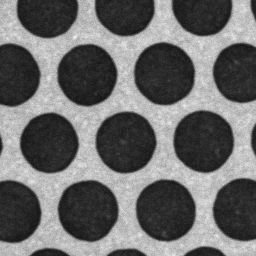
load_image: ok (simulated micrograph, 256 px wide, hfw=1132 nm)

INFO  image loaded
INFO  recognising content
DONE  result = holes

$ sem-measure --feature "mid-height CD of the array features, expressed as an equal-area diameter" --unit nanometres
270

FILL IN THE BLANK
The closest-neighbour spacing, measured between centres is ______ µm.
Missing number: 0.341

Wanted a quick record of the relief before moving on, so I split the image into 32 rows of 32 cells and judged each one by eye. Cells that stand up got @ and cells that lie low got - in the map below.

@@--------@@-------@@--------@@-
@@--------@@-------@@@-------@@-
@@-------@@@-------@@@-------@@@
@@@------@@@@-----@@@@@-----@@@@
@@@@@--@@@@@@@@-@@@@@@@@@-@@@@@@
@-@@@@@@@@@@@@@@@@@--@@@@@@@@--@
----@@@@-----@@@@@-----@@@@@----
----@@@@------@@@-------@@@-----
-----@@--------@@-------@@@-----
-----@@--------@@-------@@@-----
-----@@-------@@@-------@@@-----
----@@@@------@@@@------@@@-----
----@@@@@----@@@@@@----@@@@@@---
@@@@@@@@@@@@@@@@@@@@@@@@@@@@@@@@
@@@@@---@@@@@@----@@@@@-----@@@@
@@@------@@@@------@@@-------@@@
@@@------@@@-------@@@-------@@-
@@@-------@@--------@@-------@@-
@@@-------@@-------@@@-------@@@
@@@------@@@-------@@@-------@@@
@@@@-----@@@@-----@@@@@-----@@@@
@@@@@--@@@@@@@---@@@@@@@@--@@@@@
@@@@@@@@@@@@@@@@@@@@-@@@@@@@@---
----@@@@------@@@@-----@@@@@----
-----@@@------@@@-------@@@-----
-----@@--------@@-------@@@-----
-----@@--------@@--------@@-----
-----@@--------@@-------@@@-----
-----@@@------@@@@------@@@-----
----@@@@@----@@@@@@----@@@@@----
@@@@@@@@@@@@@@@@@@@@@@@@@@@@@@@@
@@@@----@@@@@@----@@@@@-----@@@@